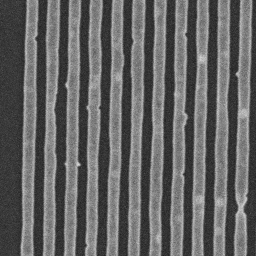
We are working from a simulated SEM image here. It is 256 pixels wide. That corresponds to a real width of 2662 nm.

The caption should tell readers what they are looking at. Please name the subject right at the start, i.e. parallel lines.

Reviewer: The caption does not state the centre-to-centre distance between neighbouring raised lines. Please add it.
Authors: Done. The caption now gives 0.222 µm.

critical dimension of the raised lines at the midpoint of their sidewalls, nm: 113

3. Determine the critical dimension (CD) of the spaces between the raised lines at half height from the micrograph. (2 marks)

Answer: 104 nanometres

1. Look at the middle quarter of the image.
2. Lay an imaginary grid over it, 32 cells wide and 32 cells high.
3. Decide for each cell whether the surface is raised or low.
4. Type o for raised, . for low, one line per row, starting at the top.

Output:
.ooo..ooo...ooo..ooo...oo...oo..
.ooo..ooo...ooo..ooo...oo...oo..
.ooo...oo...oo...ooo...oo...oo..
.ooo..ooo...oo...ooo..ooo...oo..
.ooo..ooo...oo...ooo..ooo...oo..
.ooo..ooo...oo...ooo..ooo...oo..
.ooo..ooo...oo...ooo..ooo...oo..
.ooo..ooo...oo...ooo..ooo...oo..
.ooo..ooo...oo...ooo..ooo...oo..
.ooo..ooo...oo...ooo..ooo...oo..
.oo...ooo...oo...ooo..ooo...oo..
.oo...ooo...oo...ooo..ooo...oo..
.oo...ooo...oo...ooo..ooo...oo..
.oo...ooo...oo...ooo..ooo...ooo.
.oo...ooo...oo...ooo..ooo..ooo..
.oo...ooo...oo...oo...ooo..ooo..
.oo...ooo...oo...oo...ooo..ooo..
.oo...ooo...oo...oo...ooo..ooo..
.oo...ooo...oo...oo...ooo..ooo..
.oo...ooo...oo...oo...ooo..ooo..
.oo...ooo...oo...oo...ooo..ooo..
.oo...ooo...oo...oo...ooo...oo..
.oo...ooo...oo...oo...ooo...oo..
.oo...oo....oo...oo...ooo...oo..
.ooo..oo....oo...oo...ooo..ooo..
.ooo..oo...ooo...oo...ooo..ooo..
.oo...oo...ooo..ooo...oo...ooo..
.oo...oo...ooo..ooo...oo...ooo..
.oo...oo...ooo..ooo...oo...ooo..
.oo...oo...ooo..ooo...oo...ooo..
.oo...oo...ooo..ooo...oo...ooo..
.oo...oo...ooo..ooo...oo...ooo..